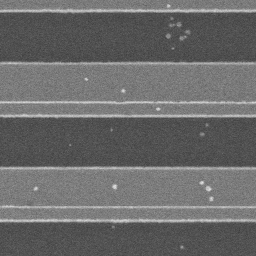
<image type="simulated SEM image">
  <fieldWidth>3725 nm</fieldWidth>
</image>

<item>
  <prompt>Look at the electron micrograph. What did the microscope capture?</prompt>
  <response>lines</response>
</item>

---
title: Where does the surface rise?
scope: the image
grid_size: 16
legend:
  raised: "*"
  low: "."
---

****************
................
................
................
****************
****************
****************
................
................
................
................
****************
****************
****************
................
................